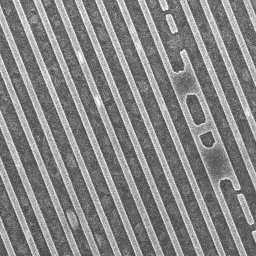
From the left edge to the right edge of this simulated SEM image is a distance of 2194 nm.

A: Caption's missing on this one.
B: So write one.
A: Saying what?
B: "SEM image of parallel lines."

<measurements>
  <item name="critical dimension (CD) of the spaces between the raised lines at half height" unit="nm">116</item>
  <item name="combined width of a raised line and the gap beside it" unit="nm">166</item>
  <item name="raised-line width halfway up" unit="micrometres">0.0508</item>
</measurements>